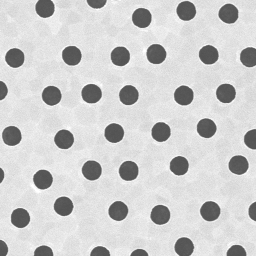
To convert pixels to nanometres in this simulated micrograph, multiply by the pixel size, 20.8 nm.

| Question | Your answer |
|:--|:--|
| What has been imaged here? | a regular array of holes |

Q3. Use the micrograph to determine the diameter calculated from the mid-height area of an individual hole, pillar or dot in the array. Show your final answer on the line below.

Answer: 419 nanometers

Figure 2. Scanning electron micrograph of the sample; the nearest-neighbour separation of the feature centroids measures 829 nanometres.